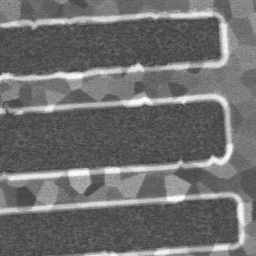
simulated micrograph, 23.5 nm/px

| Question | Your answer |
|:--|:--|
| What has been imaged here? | one or a few lines or trenches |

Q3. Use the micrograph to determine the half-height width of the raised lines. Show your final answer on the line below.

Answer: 770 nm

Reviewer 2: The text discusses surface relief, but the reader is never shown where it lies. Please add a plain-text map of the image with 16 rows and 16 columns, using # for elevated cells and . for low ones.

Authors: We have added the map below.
################
#.............##
..............##
..............##
......##########
################
#######.......##
..............##
..............##
..............##
..........######
################
##########.....#
...............#
...............#
..............##